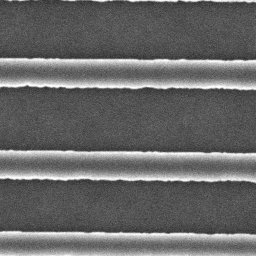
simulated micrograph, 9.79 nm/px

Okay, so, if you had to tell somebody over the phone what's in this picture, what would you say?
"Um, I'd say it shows lines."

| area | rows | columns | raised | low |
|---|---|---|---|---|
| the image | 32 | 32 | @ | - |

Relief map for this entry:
--------------------------------
--------------------------------
--------------------------------
--------------------------------
--------------------------------
--------------------------------
--------------------------------
@@@@@@@@@@@@@@@@@@-@@-@@--------
@@@@@@@@@@@@@@@@@@@@@@@@@@@@@@@@
@@@@@@@@@@@@@@@@@@@@@@@@@@@@@@@@
@@@@@@@@@@@@@@@@@@@@@@@@@@@@@@@@
--------------------------------
--------------------------------
--------------------------------
--------------------------------
--------------------------------
--------------------------------
--------------------------------
--------------------------------
@@@@@@@@@@@@@@@@@@@@@@@@@@@@@@@@
@@@@@@@@@@@@@@@@@@@@@@@@@@@@@@@@
@@@@@@@@@@@@@@@@@@@@@@@@@@@@@@@@
--------------------@--@@@@@-@@@
--------------------------------
--------------------------------
--------------------------------
--------------------------------
--------------------------------
--------------------------------
@@@@@@@@@@@@@@@@@@@@@@@@@@@@@@@@
@@@@@@@@@@@@@@@@@@@@@@@@@@@@@@@@
@@@@@@@@@@@@@@@@@@@@@@@@@@@@@@@@